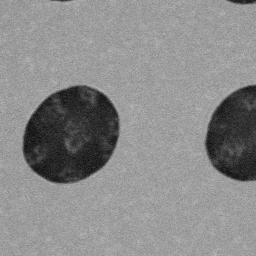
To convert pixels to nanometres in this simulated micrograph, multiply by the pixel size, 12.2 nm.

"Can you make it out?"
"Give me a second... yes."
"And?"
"holes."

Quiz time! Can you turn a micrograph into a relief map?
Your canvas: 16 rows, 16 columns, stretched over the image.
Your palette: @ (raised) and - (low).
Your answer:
@@@@@@@@@@@@@@@@
@@@@@@@@@@@@@@@@
@@@@@@@@@@@@@@@@
@@@@@@@@@@@@@@@@
@@@@@@@@@@@@@@@@
@@@@--@@@@@@@@@-
@@@----@@@@@@@--
@@-----@@@@@@---
@------@@@@@@---
@------@@@@@@---
@@----@@@@@@@---
@@@@@@@@@@@@@@@@
@@@@@@@@@@@@@@@@
@@@@@@@@@@@@@@@@
@@@@@@@@@@@@@@@@
@@@@@@@@@@@@@@@@